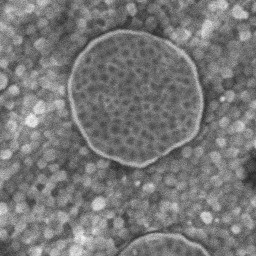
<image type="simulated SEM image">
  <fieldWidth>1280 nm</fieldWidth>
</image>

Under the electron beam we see raised bodies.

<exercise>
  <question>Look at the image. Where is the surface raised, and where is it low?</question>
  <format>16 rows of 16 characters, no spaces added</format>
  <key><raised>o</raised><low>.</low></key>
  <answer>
................
................
......oooo......
.....ooooooo....
.....ooooooo....
....oooooooo....
....ooooooooo...
.....ooooooo....
.....ooooooo....
......oooo......
................
................
................
................
................
........ooooo...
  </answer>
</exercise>